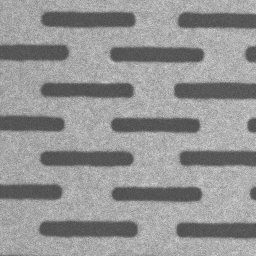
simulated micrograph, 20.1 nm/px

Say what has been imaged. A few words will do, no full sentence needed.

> holes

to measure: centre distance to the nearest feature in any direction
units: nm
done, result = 1390